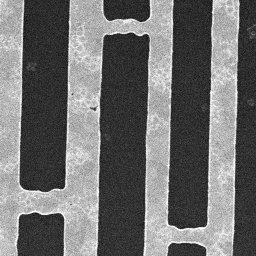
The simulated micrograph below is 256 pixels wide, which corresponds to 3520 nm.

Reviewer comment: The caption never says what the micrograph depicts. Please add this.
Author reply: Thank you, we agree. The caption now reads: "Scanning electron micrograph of one or a few lines or trenches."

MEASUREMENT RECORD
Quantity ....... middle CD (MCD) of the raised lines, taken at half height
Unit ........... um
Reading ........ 0.352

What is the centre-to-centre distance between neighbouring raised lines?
947 nanometers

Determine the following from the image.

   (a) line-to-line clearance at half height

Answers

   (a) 638 nanometers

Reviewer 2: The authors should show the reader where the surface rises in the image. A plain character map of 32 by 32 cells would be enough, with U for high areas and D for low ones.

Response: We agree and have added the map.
UUUDDDDDDUUUUDDDDDDUUUDDDDDUUUDD
UUUDDDDDDUUUUDDDDDDUUDDDDDDUUUDD
UUUDDDDDDUUUUDUDDDUUUUDDDDDUUUDD
UUUDDDDDDUUUUUUUUUUUUUDDDDDUUUDD
UUUDDDDDDUUUUDDDDDDUUDDDDDUUUUDD
UUUDDDDDDUUUUDDDDDDUUDDDDDDUUUDD
UUUDDDDDDUUUUDDDDDDUUUDDDDDUUUDD
UUUDDDDDDUUUUDDDDDDUUDDDDDDUUUDD
UUUDDDDDDUUUUDDDDDDUUDDDDDDUUUDD
UUUDDDDDDUUUUDDDDDDUUDDDDDDUUDDD
UUUDDDDDDUUUUDDDDDDUUDDDDDDUUUDD
UUUDDDDDDUUUUDDDDDDUUDDDDDUUUUDD
UUUDDDDDDUUUDDDDDDDUUDDDDDUUUUDD
UUUDDDDDDUUDDDDDDDDUUDDDDDUUUUDD
UUUDDDDDDUUUDDDDDDDUUDDDDDUUUDDD
UUUDDDDDUUUUDDDDDDUUUDDDDDUUUDDD
UUUDDDDDUUUUDDDDDDUUUDDDDDUUUDDD
UUDDDDDDUUUUDDDDDDUUUDDDDDUUUDDD
UUDDDDDDUUUUDDDDDDUUUDDDDDUUUDDD
UUDDDDDDUUUUDDDDDDUUUDDDDDUUUDDD
UUDDDDDDUUUUDDDDDDUUUDDDDDUUUDDD
UUDDDDDDUUUUDDDDDDUUUDDDDDUUUDDD
UUDDDDDDUUUUDDDDDDUUUDDDDDUUUDDD
UUUDDDDDUUUUDDDDDDUUUDDDDDUUUDDD
UUUUUUUUUUUUDDDDDDUUUDDDDDUUUDDD
UUUUUUUUUUUUDDDDDDUUUDDDDDUUUDDD
UUUUUUUUUUUUDDDDDDUUUDDDDDUUUDDD
UUDDDDDDUUUUDDDDDDUUUDDDDDUUUDDD
UUDDDDDDUUUUDDDDDDUUUUDDDUUUUDDD
UUDDDDDDUUUUDDDDDDUUUUUUUUUUUDDD
UUDDDDDDUUUUDDDDDDUUUDDDDUUUUDDD
UUDDDDDDUUUUDDDDDDUUUDDDDDUUUDDD